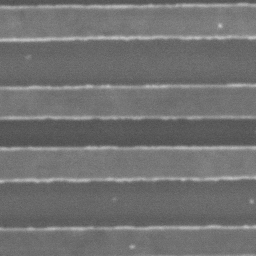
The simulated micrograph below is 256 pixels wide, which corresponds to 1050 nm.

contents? lines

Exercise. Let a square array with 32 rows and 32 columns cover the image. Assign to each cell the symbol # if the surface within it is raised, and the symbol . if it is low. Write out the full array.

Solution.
.............................##.
################################
################################
################################
################################
................................
................................
................................
................................
................................
................................
################################
################################
################################
################################
................................
................................
................................
...#......#####.################
################################
################################
################################
#######.####..###...............
................................
................................
................................
................................
................................
..............###.##############
################################
################################
################################